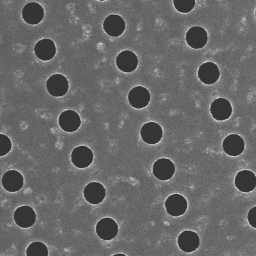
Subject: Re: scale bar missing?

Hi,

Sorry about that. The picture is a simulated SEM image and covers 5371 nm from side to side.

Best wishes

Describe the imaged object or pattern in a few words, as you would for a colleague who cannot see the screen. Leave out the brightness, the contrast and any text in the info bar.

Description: a regular array of holes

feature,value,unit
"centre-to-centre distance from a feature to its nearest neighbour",796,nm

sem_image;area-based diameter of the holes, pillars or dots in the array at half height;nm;468